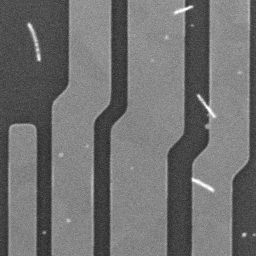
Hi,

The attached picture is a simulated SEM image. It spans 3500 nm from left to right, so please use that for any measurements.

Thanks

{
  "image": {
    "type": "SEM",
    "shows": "groups of lines, slits or small figures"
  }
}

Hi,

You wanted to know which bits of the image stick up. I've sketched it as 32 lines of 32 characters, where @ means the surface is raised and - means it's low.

---------@@@@@--@@@@@@@---@@@@@-
---------@@@@@--@@@@@@@---@@@@@-
---------@@@@@--@@@@@@@---@@@@@-
---------@@@@@--@@@@@@@---@@@@@-
---------@@@@@--@@@@@@@---@@@@@-
---------@@@@@--@@@@@@@---@@@@@-
---------@@@@@--@@@@@@@---@@@@@-
---------@@@@@--@@@@@@@---@@@@@-
---------@@@@@--@@@@@@@---@@@@@-
---------@@@@@--@@@@@@@---@@@@@-
---------@@@@@--@@@@@@@---@@@@@-
--------@@@@@@--@@@@@@@---@@@@@-
-------@@@@@@@--@@@@@@@---@@@@@-
-------@@@@@@---@@@@@@@---@@@@@-
-------@@@@@---@@@@@@@@---@@@@@-
-------@@@@@--@@@@@@@@@---@@@@@-
-@@@---@@@@@--@@@@@@@@@---@@@@@-
-@@@---@@@@@--@@@@@@@@----@@@@@-
-@@@---@@@@@--@@@@@@@-----@@@@@-
-@@@---@@@@@--@@@@@@@----@@@@@@-
-@@@---@@@@@--@@@@@@@---@@@@@@@-
-@@@---@@@@@--@@@@@@@---@@@@@@--
-@@@---@@@@@--@@@@@@@---@@@@@---
-@@@---@@@@---@@@@@@@---@@@@@---
-@@@---@@@@---@@@@@@@---@@@@@---
-@@@---@@@@@--@@@@@@@---@@@@@---
-@@@---@@@@@--@@@@@@@---@@@@@---
-@@@---@@@@@--@@@@@@@---@@@@@---
-@@@---@@@@@--@@@@@@@---@@@@@---
-@@@---@@@@@--@@@@@@@---@@@@@---
-@@@---@@@@@--@@@@@@@---@@@@@---
-@@@---@@@@@--@@@@@@@---@@@@@---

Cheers